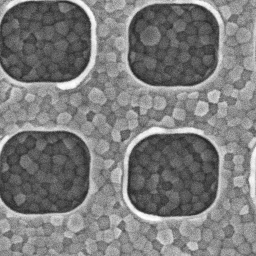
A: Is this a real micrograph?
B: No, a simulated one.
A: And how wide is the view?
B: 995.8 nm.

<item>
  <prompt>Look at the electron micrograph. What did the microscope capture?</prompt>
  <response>holes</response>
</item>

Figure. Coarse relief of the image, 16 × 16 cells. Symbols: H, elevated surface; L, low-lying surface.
HLLLLHHHHLLLLHHH
LLLLLLHHLLLLLLHH
LLLLLLHHLLLLLLHH
LLLLLLHHLLLLLLHH
LLLLLHHHLLLLLHHH
HHHHHHHHHHHHHHHH
HHHHHHHHHHHHHHHH
HHHHHHHHHHHHHHHH
HLLLLHHHHLLLLHHH
LLLLLLHHLLLLLLHH
LLLLLLHHLLLLLLHH
LLLLLLHHLLLLLLHH
LLLLLHHHLLLLLHHH
HHHHHHHHHHLLHHHH
HHHHHHHHHHHHHHHH
HHHHHHHHHHHHHHHH